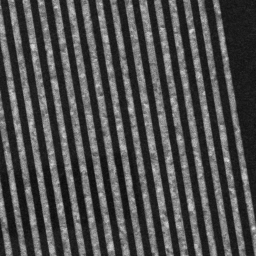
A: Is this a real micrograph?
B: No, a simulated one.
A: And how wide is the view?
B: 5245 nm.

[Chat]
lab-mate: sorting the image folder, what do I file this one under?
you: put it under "parallel lines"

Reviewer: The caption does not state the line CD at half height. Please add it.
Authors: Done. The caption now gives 131 nm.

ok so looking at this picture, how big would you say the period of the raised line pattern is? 0.295 um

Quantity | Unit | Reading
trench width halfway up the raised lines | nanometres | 162